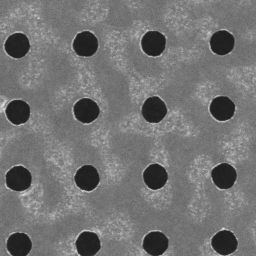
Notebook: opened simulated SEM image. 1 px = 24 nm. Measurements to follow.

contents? a regular array of holes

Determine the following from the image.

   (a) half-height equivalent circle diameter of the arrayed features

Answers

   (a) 611 nm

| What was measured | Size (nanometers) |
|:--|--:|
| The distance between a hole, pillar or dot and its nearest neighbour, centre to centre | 1600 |